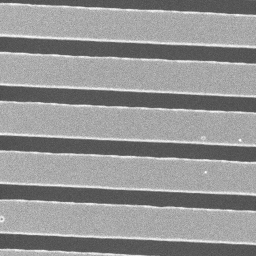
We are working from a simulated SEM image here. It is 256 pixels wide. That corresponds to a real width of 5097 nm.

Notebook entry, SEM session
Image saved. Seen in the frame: lines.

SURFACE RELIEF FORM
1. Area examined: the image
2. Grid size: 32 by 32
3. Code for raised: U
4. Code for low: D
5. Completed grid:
UUUDDDDDDDDDDDDDDDDDDDDDDDDDDDDD
UUUUUUUUUUUUUUUUUUUUUUUDDDDDDDDD
UUUUUUUUUUUUUUUUUUUUUUUUUUUUUUUU
UUUUUUUUUUUUUUUUUUUUUUUUUUUUUUUU
UUUUUUUUUUUUUUUUUUUUUUUUUUUUUUUU
DDDDDDDDDDDDDDDDDDDDDUUUUUUUUUUU
DDDDDDDDDDDDDDDDDDDDDDDDDDDDDDDD
UUUUUUUUUUUUUUUUUUUUDDDDDDDDDDDD
UUUUUUUUUUUUUUUUUUUUUUUUUUUUUUUU
UUUUUUUUUUUUUUUUUUUUUUUUUUUUUUUU
UUUUUUUUUUUUUUUUUUUUUUUUUUUUUUUU
DDDDDDDDDDDDDDDDDDDUUUUUUUUUUUUU
DDDDDDDDDDDDDDDDDDDDDDDDDDDDDDDD
UUUUUUUUUUUUUUUUUUUDDDDDDDDDDDDD
UUUUUUUUUUUUUUUUUUUUUUUUUUUUUUUU
UUUUUUUUUUUUUUUUUUUUUUUUUUUUUUUU
UUUUUUUUUUUUUUUUUUUUUUUUUUUUUUUU
DDDDDDDDDDDDDDUUUUUUUUUUUUUUUUUU
DDDDDDDDDDDDDDDDDDDDDDDDDDDDDDDD
UUUUUUUUUUUUUUUDDDDDDDDDDDDDDDDD
UUUUUUUUUUUUUUUUUUUUUUUUUUUUUUUU
UUUUUUUUUUUUUUUUUUUUUUUUUUUUUUUU
UUUUUUUUUUUUUUUUUUUUUUUUUUUUUUUU
DDDDDDDDDDDDUUUUUUUUUUUUUUUUUUUU
DDDDDDDDDDDDDDDDDDDDDDDDDDDDDDDD
UUUUUUUUUUUUUDDDDDDDDDDDDDDDDDDD
UUUUUUUUUUUUUUUUUUUUUUUUUUUUUUUU
UUUUUUUUUUUUUUUUUUUUUUUUUUUUUUUU
UUUUUUUUUUUUUUUUUUUUUUUUUUUUUUUU
DDDDDDDUUUUUUUUUUUUUUUUUUUUUUUUU
DDDDDDDDDDDDDDDDDDDDDDDDDDDDDDDU
UUUUUUUUDDDDDDDDDDDDDDDDDDDDDDDD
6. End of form